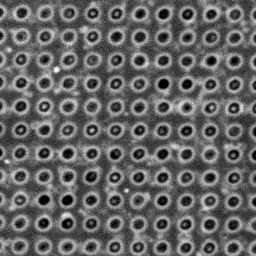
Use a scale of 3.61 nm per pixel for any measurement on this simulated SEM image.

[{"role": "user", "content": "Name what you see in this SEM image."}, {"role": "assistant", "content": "a regular array of holes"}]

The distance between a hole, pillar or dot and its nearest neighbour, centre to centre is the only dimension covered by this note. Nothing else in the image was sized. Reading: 83.1 nanometers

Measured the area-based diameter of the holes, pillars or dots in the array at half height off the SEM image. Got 0.0423 um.